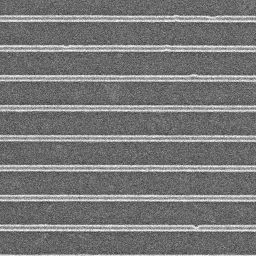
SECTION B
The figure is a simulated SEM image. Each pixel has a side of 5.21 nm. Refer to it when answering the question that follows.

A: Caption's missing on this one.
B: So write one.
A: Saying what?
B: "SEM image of parallel lines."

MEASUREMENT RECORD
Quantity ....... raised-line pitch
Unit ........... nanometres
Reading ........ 156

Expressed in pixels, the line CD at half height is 5.24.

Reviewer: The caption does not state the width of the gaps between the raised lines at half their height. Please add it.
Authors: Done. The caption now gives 132 nm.